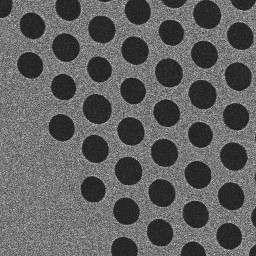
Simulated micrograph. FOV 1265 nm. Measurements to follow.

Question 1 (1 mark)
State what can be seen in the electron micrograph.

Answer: a regular array of holes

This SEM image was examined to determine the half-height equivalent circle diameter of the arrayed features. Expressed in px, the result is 26.7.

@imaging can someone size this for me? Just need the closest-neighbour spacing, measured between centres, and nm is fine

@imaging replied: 196